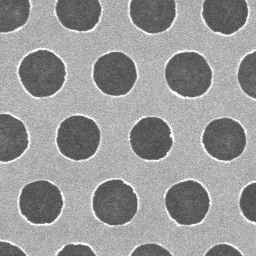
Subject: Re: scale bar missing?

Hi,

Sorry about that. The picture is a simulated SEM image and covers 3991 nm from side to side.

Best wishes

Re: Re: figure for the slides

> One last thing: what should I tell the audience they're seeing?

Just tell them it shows a regular array of holes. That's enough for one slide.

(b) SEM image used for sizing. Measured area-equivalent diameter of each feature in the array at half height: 0.698 um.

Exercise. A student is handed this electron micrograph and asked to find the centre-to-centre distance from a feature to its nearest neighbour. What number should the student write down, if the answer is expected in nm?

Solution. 1130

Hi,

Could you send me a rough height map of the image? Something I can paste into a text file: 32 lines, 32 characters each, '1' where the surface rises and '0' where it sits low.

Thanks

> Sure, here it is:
00001110000001110000001110000001
00001110000001110000001110000001
00011110000011110000001111000001
00111111000011111000011111000011
11111111111111111111111111111111
11111111111111111111111111111111
11110001111111011111111001111111
11100000111100000111100000111100
11000000111100000111100000111100
11000000111100000111100000011100
11100000111100000111100000111100
11100001111110001111110000111110
11111111111111111111111111111111
11111111111111111111111111111111
00111111100111111111111111111111
00011111000011111000011111000011
00011110000001110000011110000001
00001110000001110000001110000001
00011110000011110000011111000001
00111111000011111000011111000011
11111111111111111111111111111111
11111111111111111111111111111111
11111111111111011111111111111111
11100001111100001111100000111110
11000000111100000111100000111100
11000000111000000111100000111100
11100000111100000111100000111100
11110001111100001111110001111110
11111111111111111111111111111111
11111111111111111111111111111111
00111111111111111100111111111111
00011110000011111000011111000011